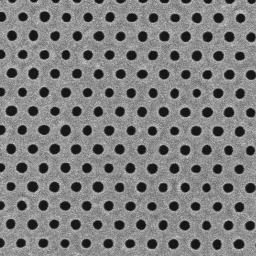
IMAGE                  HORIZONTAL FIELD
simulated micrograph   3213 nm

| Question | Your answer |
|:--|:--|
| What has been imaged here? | a regular array of holes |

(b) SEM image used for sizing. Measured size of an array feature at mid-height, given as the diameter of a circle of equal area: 130 nm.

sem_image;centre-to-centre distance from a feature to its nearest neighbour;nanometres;268